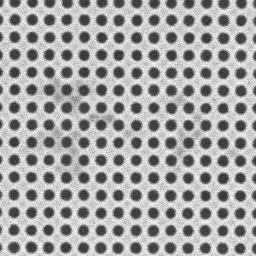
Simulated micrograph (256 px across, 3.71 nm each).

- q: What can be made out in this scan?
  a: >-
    a regular array of holes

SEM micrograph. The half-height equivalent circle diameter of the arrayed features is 41.6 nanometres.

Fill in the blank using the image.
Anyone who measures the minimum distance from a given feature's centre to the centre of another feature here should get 63.5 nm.